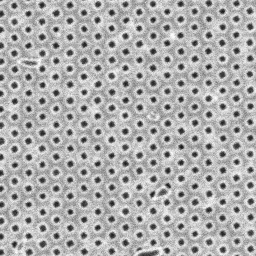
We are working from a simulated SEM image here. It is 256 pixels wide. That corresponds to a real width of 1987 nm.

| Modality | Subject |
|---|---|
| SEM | a regular array of holes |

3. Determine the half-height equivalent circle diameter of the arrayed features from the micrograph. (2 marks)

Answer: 0.0574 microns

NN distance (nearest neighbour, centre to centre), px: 15.5